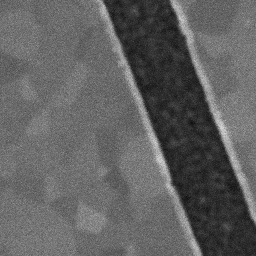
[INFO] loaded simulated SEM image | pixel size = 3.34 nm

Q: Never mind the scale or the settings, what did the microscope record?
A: one or a few lines or trenches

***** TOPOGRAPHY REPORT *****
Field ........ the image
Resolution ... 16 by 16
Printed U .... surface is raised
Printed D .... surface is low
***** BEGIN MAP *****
UUUUUUUDDDDUUUUU
UUUUUUUDDDDUUUUU
UUUUUUUDDDDDUUUU
UUUUUUUUDDDDUUUU
UUUUUUUUDDDDUUUU
UUUUUUUUUDDDDUUU
UUUUUUUUUDDDDUUU
UUUUUUUUUDDDDUUU
UUUUUUUUUUDDDDUU
UUUUUUUUUUDDDDUU
UUUUUUUUUUDDDDDU
UUUUUUUUUUUDDDDU
UUUUUUUUUUUDDDDU
UUUUUUUUUUUUDDDD
UUUUUUUUUUUUDDDD
UUUUUUUUUUUUDDDD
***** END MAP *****